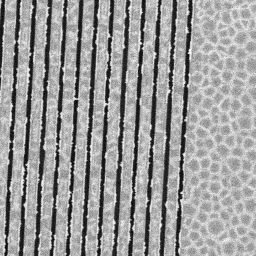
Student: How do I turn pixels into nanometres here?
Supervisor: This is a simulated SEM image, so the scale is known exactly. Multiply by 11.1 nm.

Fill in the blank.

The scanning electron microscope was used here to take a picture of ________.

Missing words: parallel lines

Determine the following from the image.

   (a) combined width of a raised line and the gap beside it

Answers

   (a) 172 nanometres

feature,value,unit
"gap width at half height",48.3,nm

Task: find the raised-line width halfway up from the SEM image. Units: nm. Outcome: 126